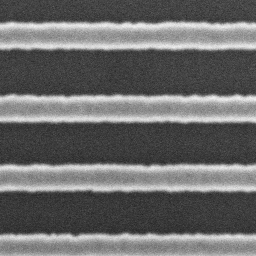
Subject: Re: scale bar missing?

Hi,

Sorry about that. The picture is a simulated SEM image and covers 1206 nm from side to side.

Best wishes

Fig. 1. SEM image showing lines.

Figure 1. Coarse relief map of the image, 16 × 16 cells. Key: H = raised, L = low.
LLLLLLLLLLLLLLLL
HHHHHHHHHHHHHLHH
HHHHHHHHHHHHHHHH
LLLLLLLLLLLLLLLL
LLLLLLLLLLLLLLLL
LLLLLLLLLLLLLLLL
HHHHHHHHHHHHHHHH
HHHHHHHHHHHHHHHH
LLLLLLLLLLLLLLLL
LLLLLLLLLLLLLLLL
HHHHHHHHHHHHHHHH
HHHHHHHHHHHHHHHH
LLLLLLLLLLLLLLLL
LLLLLLLLLLLLLLLL
LLLLLLLLLLLLLLLL
HHHHHHHHHHHHHHHH